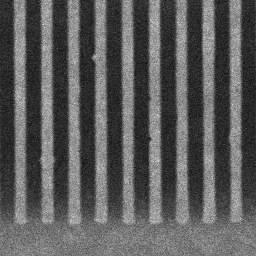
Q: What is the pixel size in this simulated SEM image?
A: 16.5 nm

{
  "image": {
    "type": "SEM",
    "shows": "parallel lines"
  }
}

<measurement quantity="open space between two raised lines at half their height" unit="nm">258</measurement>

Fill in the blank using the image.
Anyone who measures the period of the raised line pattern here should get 0.445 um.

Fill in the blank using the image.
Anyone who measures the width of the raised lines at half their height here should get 0.194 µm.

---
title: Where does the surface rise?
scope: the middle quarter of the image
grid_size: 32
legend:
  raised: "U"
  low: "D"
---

DUUUDDDDUUDDDDUUUDDDDUUUDDDDUUUD
DUUUDDDDUUDDDDUUUDDDDUUUDDDDUUUD
DUUUDDDDUUDDDDUUUDDDDUUUDDDDUUUD
DUUUDDDDUUDDDDUUUDDDDUUUDDDDUUUD
DUUUDDDDUUUDDDUUUDDDDUUUDDDDUUUD
DUUUDDDDUUUDDDUUUDDDDUUUDDDDUUUD
DUUUDDDDUUUDDDUUUDDDDUUUDDDDUUUD
DUUUDDDDUUUDDDUUUDDDDUUUDDDDUUUD
DUUUDDDDUUUDDDDUUDDDDDUUDDDDUUUD
DUUUDDDDUUUDDDDUUDDDDUUUDDDDUUUD
DUUUDDDDUUUDDDDUUDDDDUUUDDDDUUUD
DUUUDDDDUUUDDDDUUDDDDUUUDDDDUUUD
DUUUDDDDUUUDDDDUUDDDDUUUDDDDUUUD
DUUUDDDDUUUDDDDUUDDDDUUUDDDDUUUD
DUUUDDDDUUUDDDDUUDDDDUUUDDDDUUUD
DUUUDDDDUUUDDDDUUDDDDUUUDDDDUUUD
DUUUDDDDUUUDDDDUUDDDDUUUDDDDUUUD
DUUUDDDDUUUDDDDUUDDDDUUUDDDDUUUD
DUUUDDDDUUUDDDDUUDDDDDUUDDDDUUUD
DUUUDDDDUUUDDDDUUDDDDUUUDDDDUUUD
DUUUDDDDUUUDDDDUUDDDDUUUDDDDUUUD
DUUUDDDDUUUDDDDUUDDDDUUUDDDDUUUD
DUUUDDDDUUUDDDDUUDDDDUUUDDDDUUUD
DUUUDDDDUUUDDDDUUDDDDUUUDDDDUUUD
DUUUDDDDUUUDDDDUUDDDDUUUDDDDUUUD
DUUUDDDDUUUDDDDUUDDDDUUUDDDDUUUD
DUUUDDDDUUUDDDDUUDDDDUUUDDDDUUUD
DUUUDDDDUUUDDDDUUDDDDUUUDDDDUUUD
DUUUDDDDUUUDDDDUUDDDDUUUDDDDUUUD
DUUUDDDDUUUDDDDUUDDDDUUUDDDDUUUD
DUUUDDDDUUUDDDDUUDDDDUUUDDDDUUUD
DUUUDDDDUUUDDDDUUDDDDUUUDDDDUUUD